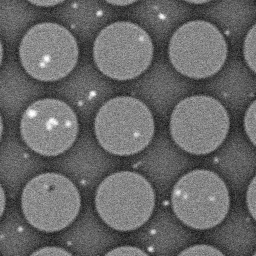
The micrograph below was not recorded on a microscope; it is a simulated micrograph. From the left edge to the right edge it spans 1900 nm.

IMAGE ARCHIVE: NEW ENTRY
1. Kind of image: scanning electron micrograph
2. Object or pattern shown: an array of small figures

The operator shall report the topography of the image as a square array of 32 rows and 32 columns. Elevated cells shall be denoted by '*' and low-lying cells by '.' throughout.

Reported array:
.....**.......**................
................................
................................
....****.....****......****.....
...******...******....******...*
...******...*******..*******...*
...*******..*******..*******...*
...*******..*******..*******...*
...******...******....*****....*
....****......***.......**......
................................
................................
......*.......***......****.....
....*****....*****....******...*
...******...*******...******...*
...*******..*******..*******...*
...*******..*******..*******...*
...******...*******...******...*
....****.....*****.....****.....
................................
................................
........................**......
....****.....*****.....*****....
...******...*******...******...*
...*******..*******...*******..*
...*******..*******...*******..*
...*******..*******...******...*
....*****....*****.....*****....
.....***......***........*......
................................
................................
.....***......****.....****.....